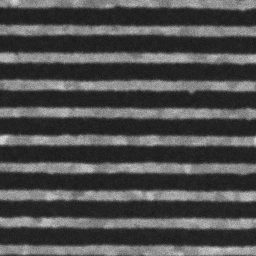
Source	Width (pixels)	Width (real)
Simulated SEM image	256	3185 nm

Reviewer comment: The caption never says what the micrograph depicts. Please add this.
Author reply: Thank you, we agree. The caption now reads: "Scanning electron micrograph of parallel lines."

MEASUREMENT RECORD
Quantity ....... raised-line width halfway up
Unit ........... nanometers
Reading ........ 104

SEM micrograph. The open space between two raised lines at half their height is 235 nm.